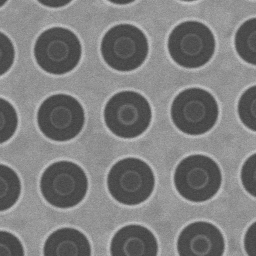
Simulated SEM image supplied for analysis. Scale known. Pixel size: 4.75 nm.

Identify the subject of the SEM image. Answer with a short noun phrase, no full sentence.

an array of small figures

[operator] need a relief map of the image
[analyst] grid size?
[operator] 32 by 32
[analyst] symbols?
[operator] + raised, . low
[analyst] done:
.++++....+++++..++++++++++++++++
++++++++++++++++++++++++++++++++
+++++++++++++++++++++++..++++++.
++++++...+++++....++++....++++..
.++++.....+++.....+++......++...
..++......++.......++......++...
..++......++.......++......++...
..++......+++.....+++.....++++..
.++++.....++++...++++++..+++++++
+++++++.++++++++++++++++++++++++
++++++++++++++++++++++++++++++++
+++++++++++++++..+++++....++++..
.++++.....+++......+++.....+++..
..+++.....+++......++......+++..
..++.......++......++......+++..
..+++......++......+++.....+++..
..+++.....++++....++++....++++++
.+++++...+++++++++++++++++++++++
++++++++++++++++++++++++++++++++
+++++++++++++++++++++++...+++++.
.+++++....++++.....+++.....+++..
..+++......++......+++......++..
...++......++.......++......++..
...++......++......+++......++..
...++......+++.....+++.....++++.
..++++....+++++...++++++++++++++
.+++++++++++++++++++++++++++++++
++++++++++++++++++++++++++++++++
+++++++...+++++....++++....++++.
..++++.....+++......++......++..
...++......+++......++......++..
...++.......++......++......+++.